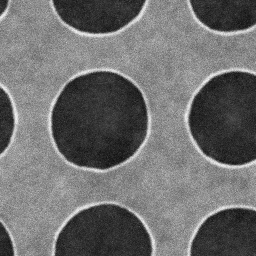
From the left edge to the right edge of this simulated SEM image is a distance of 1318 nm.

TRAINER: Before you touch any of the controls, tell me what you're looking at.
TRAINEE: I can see holes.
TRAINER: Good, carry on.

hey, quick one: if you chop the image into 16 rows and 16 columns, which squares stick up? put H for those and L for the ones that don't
HHHLLLLLLHHHLLLL
HHHHLLLLHHHHHLLL
HHHHHHHHHHHHHHHH
HHHHHHHHHHHHHHHH
HHHHHHLHHHHHHHLH
HHHHLLLLLHHHHLLL
LHHLLLLLLHHHLLLL
LHHLLLLLLHHHLLLL
LHHLLLLLLHHHLLLL
HHHHLLLLLHHHHLLL
HHHHHHLHHHHHHHHH
HHHHHHHHHHHHHHHH
HHHHHHHHHHHHHHHH
HHHHHLLLLHHHHLLL
HHHHLLLLLHHHLLLL
LHHLLLLLLLHHLLLL